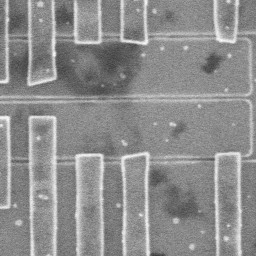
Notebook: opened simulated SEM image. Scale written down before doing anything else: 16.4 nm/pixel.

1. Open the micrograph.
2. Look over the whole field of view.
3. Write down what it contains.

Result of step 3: wiring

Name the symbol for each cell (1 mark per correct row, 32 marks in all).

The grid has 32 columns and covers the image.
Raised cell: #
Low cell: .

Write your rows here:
#...###..###...###.........###..
#...###..###...###.........###..
#...###..###...###.........###..
#...###..###...###.........##...
#...###..###...###.........##...
#...###.........................
#...###.........................
#...###.........................
#...###.........................
#...###.........................
................................
................................
................................
................................
................................
#...###.........................
#...###.........................
#...###.........................
#...###.........................
#...###...###...##.........###..
#...###...###..###.........###..
#...###...###..###.........###..
#...###...###..###.........###..
#...###...###...##.........###..
#...###...###...##.........###..
#...###...###...##.........###..
....###...###...##.........###..
....###...###...##.........###..
....###...###...##.........###..
....###...###...##.........###..
....###...###...##.........###..
....###...###...##.........###..